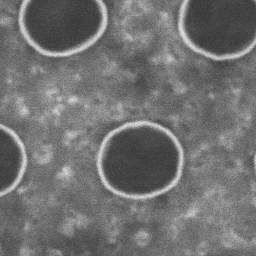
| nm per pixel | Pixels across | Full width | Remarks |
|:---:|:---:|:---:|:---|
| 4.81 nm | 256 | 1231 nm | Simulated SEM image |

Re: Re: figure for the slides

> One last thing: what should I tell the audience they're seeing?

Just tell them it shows raised bodies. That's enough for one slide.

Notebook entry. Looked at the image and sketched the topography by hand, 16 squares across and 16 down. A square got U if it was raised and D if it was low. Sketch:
DUUUUUDDDDDUUUUU
DUUUUUDDDDDUUUUU
DDUUUUDDDDDDUUUU
DDDDDDDDDDDDDUUD
DDDDDDDDDDDDDDDD
DDDDDDDDDDDDDDDD
DDDDDDDDDDDDDDDD
DDDDDDDDDDDDDDDD
UDDDDDDUUUUDDDDD
UDDDDDUUUUUDDDDD
UDDDDDUUUUUDDDDD
UDDDDDDUUUUDDDDD
DDDDDDDDDDDDDDDD
DDDDDDDDDDDDDDDD
DDDDDDDDDDDDDDDD
DDDDDDDDDDDDDDDD